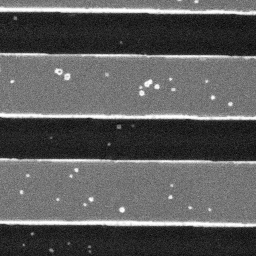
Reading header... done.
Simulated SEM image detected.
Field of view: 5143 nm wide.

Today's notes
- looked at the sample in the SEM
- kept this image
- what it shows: lines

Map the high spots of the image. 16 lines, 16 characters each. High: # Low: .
################
................
................
#########.......
################
################
################
................
................
................
################
################
################
################
................
................